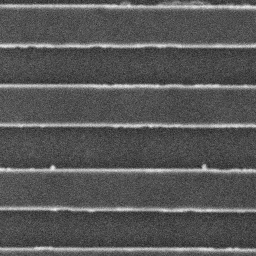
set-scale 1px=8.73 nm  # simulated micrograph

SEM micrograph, lines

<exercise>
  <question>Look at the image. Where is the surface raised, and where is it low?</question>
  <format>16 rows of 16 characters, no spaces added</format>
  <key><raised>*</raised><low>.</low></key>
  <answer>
****************
****************
****************
................
................
****************
****************
****************
................
................
................
****************
****************
................
................
..**............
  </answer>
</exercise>